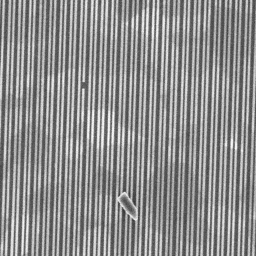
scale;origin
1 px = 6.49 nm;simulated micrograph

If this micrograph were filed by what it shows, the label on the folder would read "parallel lines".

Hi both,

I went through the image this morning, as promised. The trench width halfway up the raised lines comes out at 20.3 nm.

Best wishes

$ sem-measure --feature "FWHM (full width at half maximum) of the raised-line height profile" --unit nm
13.8